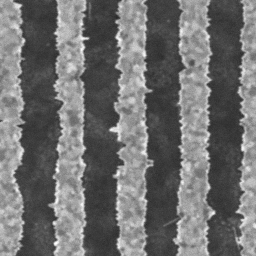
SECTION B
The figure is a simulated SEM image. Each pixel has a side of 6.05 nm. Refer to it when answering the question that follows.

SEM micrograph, one or a few lines or trenches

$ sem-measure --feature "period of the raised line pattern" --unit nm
375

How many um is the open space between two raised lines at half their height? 0.218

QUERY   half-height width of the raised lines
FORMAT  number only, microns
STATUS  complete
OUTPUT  0.159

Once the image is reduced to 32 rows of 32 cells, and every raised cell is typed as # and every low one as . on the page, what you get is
##.....####....###....####....##
###....###.....###.....###....##
###....###.....###.....###.....#
##.....###.....###.....###....##
###....###.....###.....###....##
###....###.....###....####....##
##.....###.....###.....###.....#
###....###.....###.....###....##
##.....###.....###.....###....##
##.....###.....###....####....##
##.....###.....###.....###....##
###....###.....###.....###....##
###.....##.....###....####....##
###.....##....####.....###....##
##......##.....###.....###....##
##......##.....###.....###....##
###.....##.....###.....###.....#
##.....###.....###.....###....##
###....###.....###.....###....##
###....###.....###.....###....##
##.....###.....####....###....##
##.....###.....###.....###....##
##.....###.....###.....###....##
##.....###.....###.....###....##
###....###.....###....####....##
###....###.....###....####....##
###....###.....###....#####...##
###....###.....###.....###....##
###....###.....###....####....##
###....###.....###....####....##
##.....###.....###....####....##
##.....###.....###....####....##